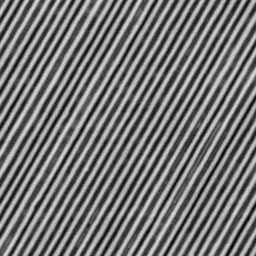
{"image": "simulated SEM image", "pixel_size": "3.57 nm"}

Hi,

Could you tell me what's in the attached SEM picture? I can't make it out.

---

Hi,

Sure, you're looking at parallel lines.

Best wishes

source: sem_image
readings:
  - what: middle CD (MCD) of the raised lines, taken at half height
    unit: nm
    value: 13.6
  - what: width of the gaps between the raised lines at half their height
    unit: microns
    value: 0.0166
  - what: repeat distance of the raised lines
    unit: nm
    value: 31.9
